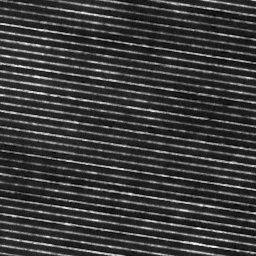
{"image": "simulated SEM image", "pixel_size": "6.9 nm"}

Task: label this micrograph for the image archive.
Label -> parallel lines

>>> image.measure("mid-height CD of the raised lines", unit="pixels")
1.86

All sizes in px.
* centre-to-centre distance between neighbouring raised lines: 7.81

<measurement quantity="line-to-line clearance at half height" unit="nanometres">45.2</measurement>